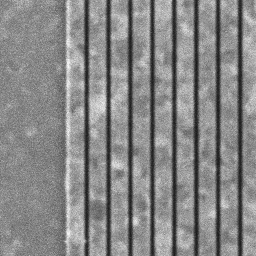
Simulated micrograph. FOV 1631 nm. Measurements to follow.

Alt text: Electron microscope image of parallel lines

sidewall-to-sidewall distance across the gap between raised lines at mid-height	32.6	nm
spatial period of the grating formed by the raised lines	0.14	micrometres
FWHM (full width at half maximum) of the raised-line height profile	0.107	µm